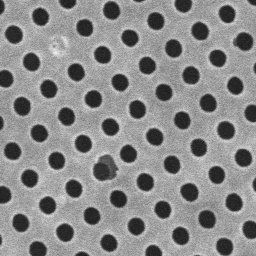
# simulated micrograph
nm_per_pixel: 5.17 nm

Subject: a regular array of holes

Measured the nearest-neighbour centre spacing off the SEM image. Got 31.6 px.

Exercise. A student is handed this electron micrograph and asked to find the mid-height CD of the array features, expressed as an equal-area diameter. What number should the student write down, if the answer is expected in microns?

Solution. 0.0911